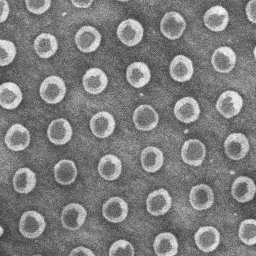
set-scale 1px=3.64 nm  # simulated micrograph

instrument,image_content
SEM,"a regular array of raised bodies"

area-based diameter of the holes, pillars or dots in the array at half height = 0.09 um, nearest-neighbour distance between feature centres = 154 nanometres